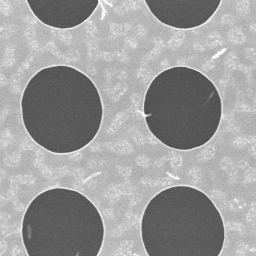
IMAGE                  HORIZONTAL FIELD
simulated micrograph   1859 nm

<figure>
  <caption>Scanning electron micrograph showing holes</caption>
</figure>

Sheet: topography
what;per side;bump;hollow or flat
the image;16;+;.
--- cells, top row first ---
++....+++.....++
+++..+++++...+++
++++++++++++++++
++++++++++++++++
++...+++++..++++
++....+++....+++
+.....+++.....++
+.....+++.....++
++....++++...+++
+++.++++++++++++
++++++++++++++++
++++++++++++++++
++....+++....+++
++....+++.....++
+.....+++.....++
++....+++.....++